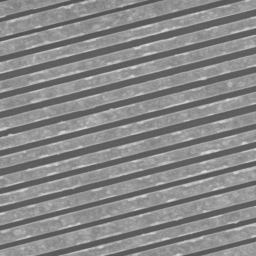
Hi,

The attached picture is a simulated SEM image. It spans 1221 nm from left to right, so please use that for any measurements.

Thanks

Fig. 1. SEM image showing parallel lines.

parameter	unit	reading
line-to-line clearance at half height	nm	28.9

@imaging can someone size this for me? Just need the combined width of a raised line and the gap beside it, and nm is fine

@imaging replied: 87.5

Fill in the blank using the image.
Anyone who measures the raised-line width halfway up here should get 52.6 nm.